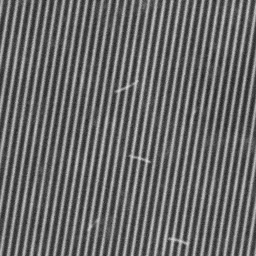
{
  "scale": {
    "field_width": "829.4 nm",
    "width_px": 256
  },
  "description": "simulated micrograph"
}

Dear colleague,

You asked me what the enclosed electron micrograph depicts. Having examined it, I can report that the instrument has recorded parallel lines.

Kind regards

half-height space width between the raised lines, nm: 19.2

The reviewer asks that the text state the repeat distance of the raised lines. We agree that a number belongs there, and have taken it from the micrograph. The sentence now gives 24.7 nanometers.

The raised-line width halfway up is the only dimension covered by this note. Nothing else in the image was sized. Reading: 5.6 nanometers